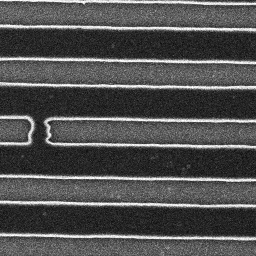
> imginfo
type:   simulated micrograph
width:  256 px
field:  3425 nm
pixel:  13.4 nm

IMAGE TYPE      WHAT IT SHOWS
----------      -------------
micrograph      parallel lines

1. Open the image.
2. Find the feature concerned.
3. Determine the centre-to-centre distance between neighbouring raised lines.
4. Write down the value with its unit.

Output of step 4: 786 nm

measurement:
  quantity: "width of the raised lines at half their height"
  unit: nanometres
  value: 452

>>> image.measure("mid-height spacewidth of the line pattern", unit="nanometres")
336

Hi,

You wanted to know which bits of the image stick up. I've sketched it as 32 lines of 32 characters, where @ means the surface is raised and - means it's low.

--------------------------------
--------------------------------
--------------------------------
@@@@@@@@@@@@@@@-----------------
@@@@@@@@@@@@@@@@@@@@@@@@@@@@@@@@
@@@@@@@@@@@@@@@@@@@@@@@@@@@@@@@@
@@@@@@@@@@@@@@@@@@@@@@@@@@@@@@@@
------------@@@@@@@@@@@@@@@@@@@@
--------------------------------
--------------------------------
--------------------------------
@@@@@@@@@@@@@@@@@@@@@@@@@@@@@@@@
@@@@@@@@@@@@@@@@@@@@@@@@@@@@@@@@
@@@@@@@@@@@@@@@@@@@@@@@@@@@@@@@@
@@@@@@@@@@@@@@@@@@@@@@@@@@@@@@@@
----@@--------------------------
----@@--------------------------
----@@--------------------------
@@@@@@@@@@@@@@@@@@@@@@@@@@@@@@@@
@@@@@@@@@@@@@@@@@@@@@@@@@@@@@@@@
@@@@@@@@@@@@@@@@@@@@@@@@@@@@@@@@
@@@@@@@@@@@@@@@@@@@@@@@@@@@@@@@@
----------------------------@@@-
--------------------------------
--------------------------------
@@@@@@@@@@@@--------------------
@@@@@@@@@@@@@@@@@@@@@@@@@@@@@@@@
@@@@@@@@@@@@@@@@@@@@@@@@@@@@@@@@
@@@@@@@@@@@@@@@@@@@@@@@@@@@@@@@@
--------@@@@@@@@@@@@@@@@@@@@@@@@
--------------------------------
--------------------------------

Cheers